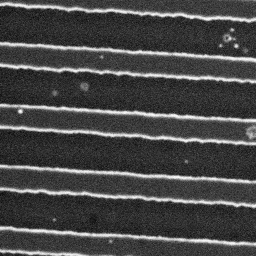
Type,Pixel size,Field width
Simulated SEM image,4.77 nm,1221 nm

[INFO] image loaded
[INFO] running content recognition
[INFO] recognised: lines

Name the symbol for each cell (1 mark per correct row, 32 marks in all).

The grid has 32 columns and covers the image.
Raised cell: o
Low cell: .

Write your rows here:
oooooooooooooooooooooooooooooooo
...............ooooooooooooooooo
..............................oo
................................
................................
ooo.............................
ooooooooooooooooo...............
oooooooooooooooooooooooooooooooo
..oooooooooooooooooooooooooooooo
..................oooooooooooooo
................................
................................
................................
oooooooo........................
ooooooooooooooooooooooo.........
oooooooooooooooooooooooooooooooo
........oooooooooooooooooooooooo
......................oooooooooo
................................
................................
................................
oooooooooooooo..................
ooooooooooooooooooooooooooooo...
oooooooooooooooooooooooooooooooo
............oooooooooooooooooooo
............................oooo
................................
................................
o...............................
ooooooooooooooooo...............
oooooooooooooooooooooooooooooooo
.ooooooooooooooooooooooooooooooo